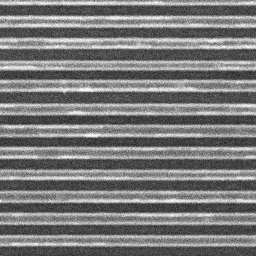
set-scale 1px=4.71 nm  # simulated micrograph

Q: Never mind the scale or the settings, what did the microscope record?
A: parallel lines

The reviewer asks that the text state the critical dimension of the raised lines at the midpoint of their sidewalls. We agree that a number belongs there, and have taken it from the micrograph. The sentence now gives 47.1 nm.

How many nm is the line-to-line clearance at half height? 56.5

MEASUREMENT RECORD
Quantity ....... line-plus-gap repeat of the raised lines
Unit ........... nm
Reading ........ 103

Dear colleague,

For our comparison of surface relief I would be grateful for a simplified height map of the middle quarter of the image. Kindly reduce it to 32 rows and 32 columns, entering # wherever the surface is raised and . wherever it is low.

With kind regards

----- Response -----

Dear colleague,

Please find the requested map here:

################################
................................
................................
................................
################################
################################
################################
................................
................................
................................
################################
################################
.#.#####.#....###..............#
................................
................................
#########################.......
################################
################################
................................
................................
................................
################################
################################
................................
................................
................................
................................
################################
################################
................................
................................
................................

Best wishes